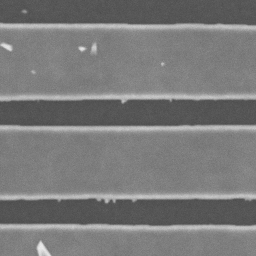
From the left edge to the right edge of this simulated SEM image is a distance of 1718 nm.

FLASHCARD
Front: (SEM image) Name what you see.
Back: lines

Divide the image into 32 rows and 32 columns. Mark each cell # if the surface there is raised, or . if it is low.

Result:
................................
................................
................................
################################
################################
################################
################################
################################
################################
################################
################################
################################
................................
................................
................................
................................
################################
################################
################################
################################
################################
################################
################################
################################
################################
................................
................................
................................
################################
################################
################################
################################